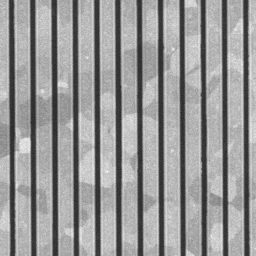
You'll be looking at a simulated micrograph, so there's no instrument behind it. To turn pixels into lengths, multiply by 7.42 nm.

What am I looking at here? parallel lines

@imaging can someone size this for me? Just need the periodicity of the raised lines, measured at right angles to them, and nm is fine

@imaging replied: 158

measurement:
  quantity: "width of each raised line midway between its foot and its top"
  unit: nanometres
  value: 105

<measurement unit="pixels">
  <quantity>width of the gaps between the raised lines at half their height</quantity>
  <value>7.49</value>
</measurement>